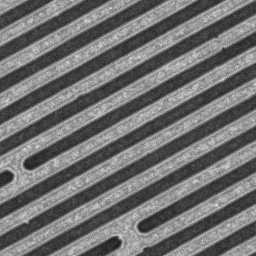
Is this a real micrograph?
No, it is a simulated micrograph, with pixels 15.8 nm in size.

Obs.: parallel lines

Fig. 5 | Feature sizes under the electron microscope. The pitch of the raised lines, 437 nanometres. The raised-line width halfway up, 13.7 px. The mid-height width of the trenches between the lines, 218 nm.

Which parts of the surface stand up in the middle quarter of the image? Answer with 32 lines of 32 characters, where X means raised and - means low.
XXXX-------XXXXXXX-------XXXXXXX
XX-------XXXXXXX-------XXXXXXX--
-------XXXXXXX-------XXXXXXX----
-----XXXXXXX--------XXXXXX------
----XXXXXXX-------XXXXXXX-------
--XXXXXXX-------XXXXXXX-------XX
XXXXXXX-------XXXXXXX-------XXXX
XXXX--------XXXXXXX--------XXXXX
XXX--------XXXXXX--------XXXXXXX
X--------XXXXXXX-------XXXXXXX--
-------XXXXXXX-------XXXXXXX----
------XXXXXX-------XXXXXXX------
----XXXXXX--------XXXXXX--------
--XXXXXX--------XXXXXXX-------XX
XXXXXX--------XXXXXXX--------XXX
XXXXX--------XXXXXX--------XXXXX
XXX--------XXXXXX--------XXXXXX-
X--------XXXXXX--------XXXXXXX--
-------XXXXXXX-------XXXXXXX----
-----XXXXXXX-------XXXXXXX------
---XXXXXXX-------XXXXXXX--------
-XXXXXXX-------XXXXXXX--------XX
XXXXXX--------XXXXXX--------XXXX
XXXXX-------XXXXXXX--------XXXXX
XXX-------XXXXXXX--------XXXXXX-
X-------XXXXXXX--------XXXXXX---
------XXXXXXX--------XXXXXX-----
-----XXXXXXX-------XXXXXXX------
---XXXXXXX--------XXXXXX--------
-XXXXXXX--------XXXXXX--------XX
XXXXXX--------XXXXXX--------XXXX
XXXX--------XXXXXX--------XXXXXX